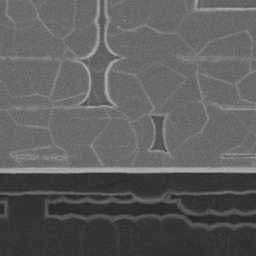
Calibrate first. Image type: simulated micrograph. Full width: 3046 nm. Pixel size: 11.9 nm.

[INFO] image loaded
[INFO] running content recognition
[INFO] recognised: wiring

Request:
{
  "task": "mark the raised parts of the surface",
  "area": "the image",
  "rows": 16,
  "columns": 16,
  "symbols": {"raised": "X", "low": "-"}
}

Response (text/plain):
XXXXXXXXXXXXXXXX
XXXXXXXXXXXXXXXX
XXXXXXXXXXXXXXXX
XXXXXXXXXXXXXXXX
XXXXXXXXXXXXXXXX
XXXXXXXXXXXXXXXX
XXXXXXXXXXXXXXXX
XXXXXXXXXXXXXXXX
XXXXXXXXXXXXXXXX
XXXXXXXXXXXXXXXX
XXXXXXXXXXXXXXXX
----------------
----------------
----------------
----------------
----------------